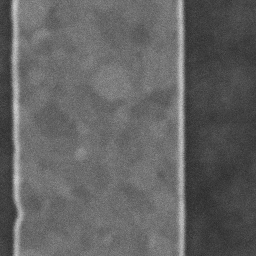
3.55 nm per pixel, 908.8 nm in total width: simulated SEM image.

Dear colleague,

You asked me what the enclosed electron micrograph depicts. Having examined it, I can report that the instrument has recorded one or a few lines or trenches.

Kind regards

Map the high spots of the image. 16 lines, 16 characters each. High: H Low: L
LHHHHHHHHHHLLLLL
LHHHHHHHHHHLLLLL
LHHHHHHHHHHLLLLL
LHHHHHHHHHHLLLLL
LHHHHHHHHHHLLLLL
LHHHHHHHHHHLLLLL
LHHHHHHHHHHLLLLL
LHHHHHHHHHHLLLLL
LHHHHHHHHHHLLLLL
LHHHHHHHHHHLLLLL
LHHHHHHHHHHLLLLL
LHHHHHHHHHHLLLLL
LHHHHHHHHHHLLLLL
LHHHHHHHHHHLLLLL
LHHHHHHHHHHLLLLL
LHHHHHHHHHHLLLLL